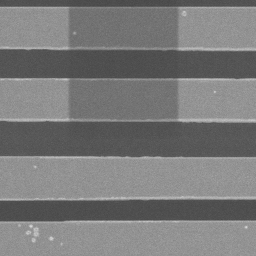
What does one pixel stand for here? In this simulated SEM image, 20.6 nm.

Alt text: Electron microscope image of lines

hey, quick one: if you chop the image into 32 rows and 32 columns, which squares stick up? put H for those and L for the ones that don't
LLLLLLLLLLLLLLLLLLLLLLLLLLLLLLLL
HHHHHHHHHHHHHHHHHHHHHHHHHHHHHHHH
HHHHHHHHHHHHHHHHHHHHHHHHHHHHHHHH
HHHHHHHHHHHHHHHHHHHHHHHHHHHHHHHH
HHHHHHHHHHHHHHHHHHHHHHHHHHHHHHHH
HHHHHHHHHHHHHHHHHHHHHHHHHHHHHHHH
LLLLLLLLLLLLLLLLLLLLLLLLLLLLLLLL
LLLLLLLLLLLLLLLLLLLLLLLLLLLLLLLL
LLLLLLLLLLLLLLLLLLLLLLLLLLLLLLLL
LLLLLLLLLLLLLLLLLLLLLLLLLLLLLLLL
HHHHHHHHHHHHHHHHHHHHHHHHHHHHHHHH
HHHHHHHHHHHHHHHHHHHHHHHHHHHHHHHH
HHHHHHHHHHHHHHHHHHHHHHHHHHHHHHHH
HHHHHHHHHHHHHHHHHHHHHHHHHHHHHHHH
HHHHHHHHHHHHHHHHHHHHHHHHHHHHHHHH
LLLLLLLLLLLLLLLLLLLLLLLLLLLLLLLL
LLLLLLLLLLLLLLLLLLLLLLLLLLLLLLLL
LLLLLLLLLLLLLLLLLLLLLLLLLLLLLLLL
LLLLLLLLLLLLLLLLLLLLLLLLLLLLLLLL
LLLLLLLLLLLLLLLLLLLLLLLLLLLLLLLL
HHHHHHHHHHHHHHHHHHHHHHHHHHHHHHHH
HHHHHHHHHHHHHHHHHHHHHHHHHHHHHHHH
HHHHHHHHHHHHHHHHHHHHHHHHHHHHHHHH
HHHHHHHHHHHHHHHHHHHHHHHHHHHHHHHH
HHHHHHHHHHHHHHHHHHHHHHHHHHHHHHHH
LLLLLLLLLLLLLLLLLLLLLLLLLLLLLLLL
LLLLLLLLLLLLLLLLLLLLLLLLLLLLLLLL
LLLLLLLLLLLLLLLLLLLLLLLLLLLLLLLL
HHHHHHHHHHHHHHHHHHHHHHHHHHHHHHHH
HHHHHHHHHHHHHHHHHHHHHHHHHHHHHHHH
HHHHHHHHHHHHHHHHHHHHHHHHHHHHHHHH
HHHHHHHHHHHHHHHHHHHHHHHHHHHHHHHH